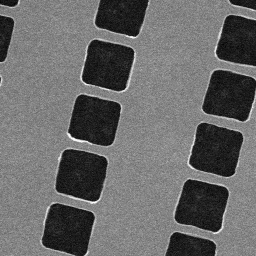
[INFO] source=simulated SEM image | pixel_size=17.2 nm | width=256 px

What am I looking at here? holes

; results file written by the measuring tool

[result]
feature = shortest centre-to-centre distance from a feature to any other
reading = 971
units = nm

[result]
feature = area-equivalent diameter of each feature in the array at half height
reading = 896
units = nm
